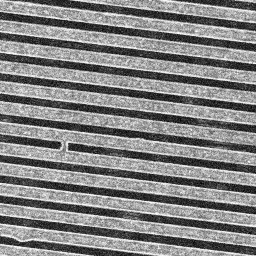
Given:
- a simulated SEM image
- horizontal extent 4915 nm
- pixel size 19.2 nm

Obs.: parallel lines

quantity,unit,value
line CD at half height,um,0.212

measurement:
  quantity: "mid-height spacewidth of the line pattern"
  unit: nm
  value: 176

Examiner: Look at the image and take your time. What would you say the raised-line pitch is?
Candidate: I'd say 0.388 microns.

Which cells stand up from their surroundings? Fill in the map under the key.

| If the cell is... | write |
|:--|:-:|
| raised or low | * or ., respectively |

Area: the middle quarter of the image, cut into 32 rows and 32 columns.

.............*******************
*....................***********
*********....................***
*****************...............
....*********************.......
............********************
....................************
********....................****
****************................
...*********************........
...........*********************
...................*************
*******....................*****
****************................
..*********************.........
..........*********************.
..................**************
*******...................******
***************.................
*.*********************.........
*.........*********************.
*.................**************
******....................******
**************..................
.*********************..........
.........*********************..
.................***************
*****....................*******
*************...................
*********************...........
........*********************...
...............*****************